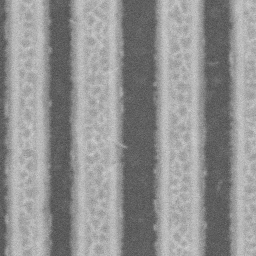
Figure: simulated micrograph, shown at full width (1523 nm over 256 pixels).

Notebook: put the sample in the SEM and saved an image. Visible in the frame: one or a few lines or trenches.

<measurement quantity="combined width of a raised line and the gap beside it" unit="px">76.2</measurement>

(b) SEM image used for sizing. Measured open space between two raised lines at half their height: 263 nanometres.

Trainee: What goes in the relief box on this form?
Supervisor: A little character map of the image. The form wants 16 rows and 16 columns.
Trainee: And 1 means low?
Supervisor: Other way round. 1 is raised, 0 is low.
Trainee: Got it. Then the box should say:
0110011000110001
0110011000110001
0110011000110001
0110011000110001
0110011000110001
0110011000110001
0110011000110001
0110011000110001
0110011000110001
0110011000110001
0110011000110001
0110011000110001
0110011000110001
0110011000110001
0110011000110001
0110011000110001